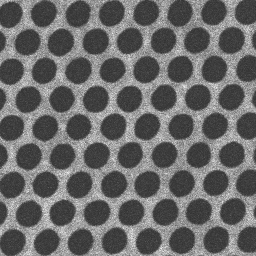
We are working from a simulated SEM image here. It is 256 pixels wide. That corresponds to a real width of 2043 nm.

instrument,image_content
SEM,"a regular array of holes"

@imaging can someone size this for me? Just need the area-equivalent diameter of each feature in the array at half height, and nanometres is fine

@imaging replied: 212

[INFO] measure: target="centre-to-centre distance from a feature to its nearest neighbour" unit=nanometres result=262